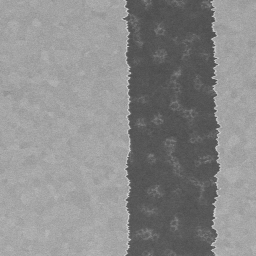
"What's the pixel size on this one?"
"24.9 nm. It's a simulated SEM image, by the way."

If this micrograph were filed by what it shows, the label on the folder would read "one or a few lines or trenches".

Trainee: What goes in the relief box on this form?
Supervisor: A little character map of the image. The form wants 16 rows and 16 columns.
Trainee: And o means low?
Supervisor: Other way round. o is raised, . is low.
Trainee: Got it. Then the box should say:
oooooooo.....ooo
oooooooo.....ooo
oooooooo.....ooo
oooooooo.....ooo
oooooooo.....ooo
oooooooo.....ooo
oooooooo.....ooo
oooooooo......oo
oooooooo......oo
oooooooo......oo
oooooooo......oo
oooooooo......oo
oooooooo......oo
oooooooo.....ooo
oooooooo.....ooo
oooooooo.....ooo